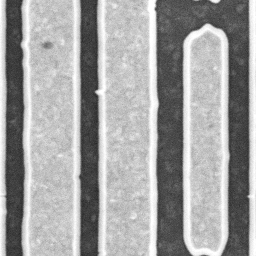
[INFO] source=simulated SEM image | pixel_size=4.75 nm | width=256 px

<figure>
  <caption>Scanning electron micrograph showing one or a few lines or trenches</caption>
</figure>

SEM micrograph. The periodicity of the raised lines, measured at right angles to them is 76.8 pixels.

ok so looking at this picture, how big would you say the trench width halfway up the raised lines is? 119 nm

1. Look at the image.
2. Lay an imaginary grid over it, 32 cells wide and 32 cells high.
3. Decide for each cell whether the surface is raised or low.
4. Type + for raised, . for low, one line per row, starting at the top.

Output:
...+++++++...++++++.............
...+++++++...++++++.............
...+++++++...++++++.............
...+++++++...++++++.............
...+++++++...++++++.....++++....
...+++++++...++++++....+++++....
...+++++++...++++++....+++++....
...+++++++...++++++....+++++....
...+++++++...++++++....+++++....
...+++++++...++++++....+++++....
...+++++++...++++++....+++++....
...+++++++...++++++....+++++....
...+++++++...++++++....+++++....
...+++++++...++++++....+++++....
...+++++++...++++++....+++++....
...+++++++...++++++....+++++....
...+++++++...++++++....+++++....
...+++++++...++++++....+++++....
...+++++++...++++++....+++++....
...+++++++...++++++....+++++....
...+++++++...++++++....+++++....
...+++++++...++++++....+++++....
...+++++++...++++++....+++++....
...+++++++...++++++....+++++....
...+++++++...++++++....+++++...+
...+++++++...++++++....+++++....
...+++++++...++++++....+++++....
...+++++++...++++++....+++++....
...+++++++...++++++....+++++....
...+++++++...++++++....+++++....
...+++++++...++++++.....++++....
...+++++++...++++++.....+.++....